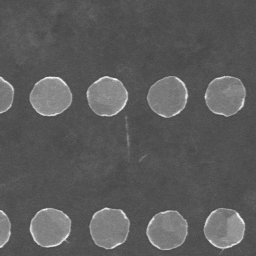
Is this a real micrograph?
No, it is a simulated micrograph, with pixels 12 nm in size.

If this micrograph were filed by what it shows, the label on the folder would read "a regular array of raised bodies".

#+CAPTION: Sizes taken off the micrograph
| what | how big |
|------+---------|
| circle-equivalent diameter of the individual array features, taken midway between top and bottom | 481 nm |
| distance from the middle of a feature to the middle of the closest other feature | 57.4 px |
